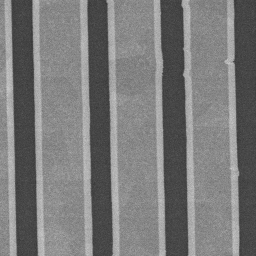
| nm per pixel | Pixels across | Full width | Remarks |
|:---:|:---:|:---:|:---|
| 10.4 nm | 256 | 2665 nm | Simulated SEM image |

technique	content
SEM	one or a few lines or trenches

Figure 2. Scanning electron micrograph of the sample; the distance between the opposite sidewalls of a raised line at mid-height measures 0.495 micrometres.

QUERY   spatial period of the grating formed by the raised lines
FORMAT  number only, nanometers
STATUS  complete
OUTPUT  775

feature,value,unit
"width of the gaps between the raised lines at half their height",0.268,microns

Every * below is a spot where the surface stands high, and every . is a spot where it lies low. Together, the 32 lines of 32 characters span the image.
*...*******...******...******...
*...*******...******...******...
*...*******...******...******...
*...*******...******...******...
*...*******...******...******...
*...*******...******...******...
*...*******...******...******...
*...*******...******...******...
*....******...******...******...
*....******...******...******...
*....******...******...******...
*....******...******....*****...
*....******...******...******...
*....******...******....*****...
*....******...******....*****...
*....******...******....*****...
*....******...******....*****...
*....******...******....*****...
*....******...******....*****...
**...******...******....*****...
**...******...******....*****...
**...******...******....*****...
**...******...******....*****...
**...******...******....*****...
**...******...******....*****...
**...******...******....*****...
**...******...******....******..
**...******...******....******..
**...******...******....******..
**...******...******....******..
**...******...******....******..
**...******...******....******..